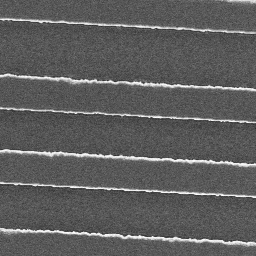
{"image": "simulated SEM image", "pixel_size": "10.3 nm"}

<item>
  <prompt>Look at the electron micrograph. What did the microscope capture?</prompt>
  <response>lines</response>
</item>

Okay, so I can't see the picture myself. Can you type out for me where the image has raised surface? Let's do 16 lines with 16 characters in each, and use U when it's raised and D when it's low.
UUUUUUUUUUUUUUUU
DDDDDDUUUUUUUUUU
DDDDDDDDDDDDDDDD
DDDDDDDDDDDDDDDD
DDDDDDDDDDDDDDDD
UUUUUUUUUUUUUUUD
UUUUUUUUUUUUUUUU
DDDDDDDDDDDDDUUU
DDDDDDDDDDDDDDDD
UUUDDDDDDDDDDDDD
UUUUUUUUUUUUUUUU
UUUUUUUUUUUUUUUU
DDDDDDDDDDDDDDDD
DDDDDDDDDDDDDDDD
UUUUDDDDDDDDDDDD
UUUUUUUUUUUUUUUU